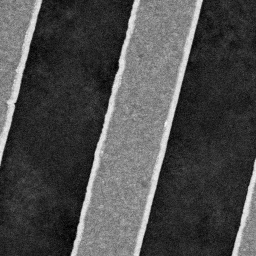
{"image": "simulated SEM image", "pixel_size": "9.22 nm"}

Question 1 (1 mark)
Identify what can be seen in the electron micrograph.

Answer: one or a few lines or trenches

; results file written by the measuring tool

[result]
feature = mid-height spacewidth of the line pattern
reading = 874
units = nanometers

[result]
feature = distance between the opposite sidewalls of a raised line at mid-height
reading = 572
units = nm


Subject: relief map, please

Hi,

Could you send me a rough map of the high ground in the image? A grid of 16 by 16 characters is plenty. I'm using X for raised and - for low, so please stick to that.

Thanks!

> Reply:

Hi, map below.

XX------XXXX----
XX------XXXX----
XX------XXXX----
XX------XXXX----
X------XXXX-----
X------XXXX-----
X------XXXX-----
X------XXXX-----
------XXXX------
------XXXX------
------XXXX------
------XXXX------
-----XXXX-------
-----XXXX------X
-----XXXX------X
-----XXXX------X